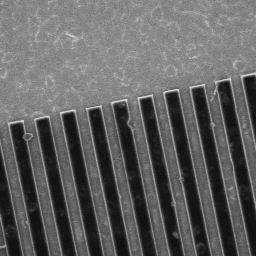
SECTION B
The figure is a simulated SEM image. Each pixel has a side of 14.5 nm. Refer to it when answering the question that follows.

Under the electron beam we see parallel lines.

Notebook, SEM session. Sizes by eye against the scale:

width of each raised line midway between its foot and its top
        15.6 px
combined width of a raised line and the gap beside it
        380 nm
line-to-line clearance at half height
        156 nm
